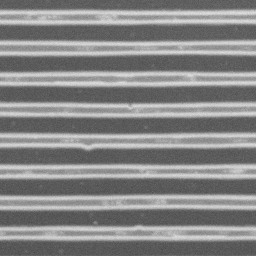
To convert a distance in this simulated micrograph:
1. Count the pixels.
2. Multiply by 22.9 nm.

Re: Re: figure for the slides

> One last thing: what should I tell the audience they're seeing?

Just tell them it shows parallel lines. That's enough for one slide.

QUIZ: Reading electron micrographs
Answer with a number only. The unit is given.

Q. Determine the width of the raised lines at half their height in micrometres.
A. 0.238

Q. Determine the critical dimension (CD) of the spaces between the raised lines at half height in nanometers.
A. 462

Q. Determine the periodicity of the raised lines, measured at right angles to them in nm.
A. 708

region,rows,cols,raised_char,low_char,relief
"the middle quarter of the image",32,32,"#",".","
................................
................................
....................###########.
################################
################################
................................
................................
................................
................................
................................
################################
################################
################################
................................
................................
................................
................................
................................
################################
################################
.....###........................
................................
................................
................................
................................
................................
################################
################################
................................
................................
................................
................................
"